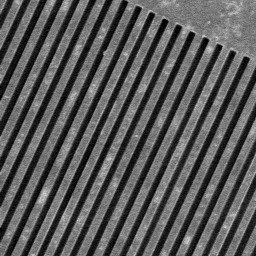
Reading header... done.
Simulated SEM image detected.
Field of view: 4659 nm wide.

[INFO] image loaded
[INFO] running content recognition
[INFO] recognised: parallel lines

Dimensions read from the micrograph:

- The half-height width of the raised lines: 142 nm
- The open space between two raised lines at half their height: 126 nanometers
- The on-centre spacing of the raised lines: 14.9 px